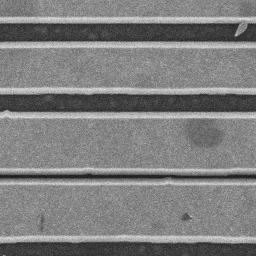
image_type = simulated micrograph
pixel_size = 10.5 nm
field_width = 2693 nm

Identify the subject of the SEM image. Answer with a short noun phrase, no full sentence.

one or a few lines or trenches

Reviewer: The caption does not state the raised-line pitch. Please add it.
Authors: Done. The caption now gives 752 nanometres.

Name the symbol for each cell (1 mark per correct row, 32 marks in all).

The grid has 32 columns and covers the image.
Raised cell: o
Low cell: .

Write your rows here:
oooooooooooooooooooooooooooooooo
oooooooooooooooooooooooooooooooo
oooooooooooooooooooooooooooooooo
..............................o.
................................
................................
oooooooooooooooooooooooooooooooo
oooooooooooooooooooooooooooooooo
oooooooooooooooooooooooooooooooo
oooooooooooooooooooooooooooooooo
oooooooooooooooooooooooooooooooo
................................
................................
................................
oooooooooooooooooooooooooooooooo
oooooooooooooooooooooooooooooooo
oooooooooooooooooooooooooooooooo
oooooooooooooooooooooooooooooooo
oooooooooooooooooooooooooooooooo
oooooooooooooooooooooooooooooooo
oooooooooooooooooooooooooooooooo
................................
................................
oooooooooooooooooooooooooooooooo
oooooooooooooooooooooooooooooooo
oooooooooooooooooooooooooooooooo
oooooooooooooooooooooooooooooooo
oooooooooooooooooooooooooooooooo
oooooooooooooooooooooooooooooooo
oooooooooooooooooooooooooooooooo
................................
................................